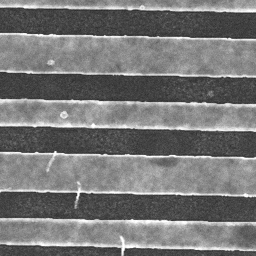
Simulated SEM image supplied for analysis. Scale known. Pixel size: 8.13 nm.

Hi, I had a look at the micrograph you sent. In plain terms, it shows lines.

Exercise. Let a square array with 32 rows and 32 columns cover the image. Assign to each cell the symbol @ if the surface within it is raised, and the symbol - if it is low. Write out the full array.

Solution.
@@@@@@@@@@@@@@@@@@@@@@@@@@@@@@@@
--------------------------------
--------------------------------
--------------------------------
@@@@@@@@@@@@-@-@----------------
@@@@@@@@@@@@@@@@@@@@@@@@@@@@@@@@
@@@@@@@@@@@@@@@@@@@@@@@@@@@@@@@@
@@@@@@@@@@@@@@@@@@@@@@@@@@@@@@@@
@@@@@@@@@@@@@@@@@@@@@@@@@@@@@@@@
--------------------------@@@@@@
--------------------------------
--------------------------------
@@@@@@--------------------------
@@@@@@@@@@@@@@@@@@@@@@@@@@@@@@@@
@@@@@@@@@@@@@@@@@@@@@@@@@@@@@@@@
@@@@@@@@@@@@@@@@@@@@@@@@@@@@@@@@
--------------------------------
--------------------------------
--------------------------------
@@@@@@@@@@@@@@@@@@@--@----------
@@@@@@@@@@@@@@@@@@@@@@@@@@@@@@@@
@@@@@@@@@@@@@@@@@@@@@@@@@@@@@@@@
@@@@@@@@@@@@@@@@@@@@@@@@@@@@@@@@
@@@@@@@@@@@@@@@@@@@@@@@@@@@@@@@@
------------------------------@@
--------------------------------
--------------------------------
@@@@@@@@@@----------------------
@@@@@@@@@@@@@@@@@@@@@@@@@@@@@@@@
@@@@@@@@@@@@@@@@@@@@@@@@@@@@@@@@
--@@@@@@@@@@@@@@@@@@@@@@@@@@@@@@
--------------------------------